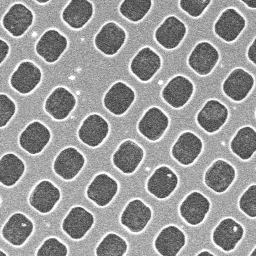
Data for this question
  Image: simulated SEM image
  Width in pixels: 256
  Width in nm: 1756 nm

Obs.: a regular array of holes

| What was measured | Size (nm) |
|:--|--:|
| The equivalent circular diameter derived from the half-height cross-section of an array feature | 211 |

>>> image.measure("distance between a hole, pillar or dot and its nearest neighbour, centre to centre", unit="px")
41.2